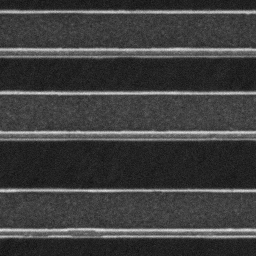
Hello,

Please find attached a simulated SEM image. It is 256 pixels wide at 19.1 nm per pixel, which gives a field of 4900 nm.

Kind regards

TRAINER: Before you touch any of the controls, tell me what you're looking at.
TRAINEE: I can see lines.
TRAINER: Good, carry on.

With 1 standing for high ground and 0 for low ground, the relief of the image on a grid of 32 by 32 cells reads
11111111111111111111111111111111
00000000000000000000000000000000
00000000000000000000000000000000
00000000000000000000000000000000
00000000000000000000000000000000
00000000000000000000000000000000
11111111111111111111111111111111
11111111111111111111111111111111
11111111111111111111111111111111
11111111111111111111111111111111
11111111111111111111111111111111
11111111111111111111111111111111
00000000000000000000000000000000
00000000000000000000000000000000
00000000000000000000000000000000
00000000000000000000000000000000
00000000000000000000000000000000
11111111111111111111111111111111
11111111111111111111111111111111
11111111111111111111111111111111
11111111111111111111111111111111
11111111111111111111111111111111
11111111111111111111111111111111
11111111111111111111111111111111
00000000000000000000000000000000
00000000000000000000000000000000
00000000000000000000000000000000
00000000000000000000000000000000
00000000000000000000000000000000
11111111111111111111111111111111
11111111111111111111111111111111
11111111111111111111111111111111